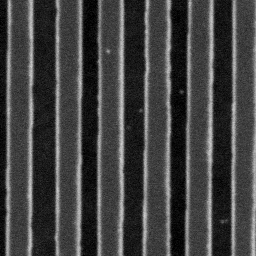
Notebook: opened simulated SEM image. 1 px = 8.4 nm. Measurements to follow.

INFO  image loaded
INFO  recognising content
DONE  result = lines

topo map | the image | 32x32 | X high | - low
-XXX---XXX--XXX---XXX---XXX--XXX
-XXX---XXX--XXX---XXX---XXX--XXX
-XXX---XXX--XXX---XXX---XXX--XXX
-XXX---XXX--XXX---XXX---XXX--XXX
-XXX---XXX--XXX---XXX---XXX--XXX
-XXX---XXX--XXX---XXX---XXX--XXX
-XXX---XXX--XXX---XXX---XX---XXX
-XXX---XXX--XXX---XXX---XX---XXX
-XXX---XXX--XXX---XXX---XX---XXX
-XXX---XXX--XXX---XXX---XXX--XXX
-XXX---XXX--XXX---XXX---XX---XXX
-XXX---XXX--XXX---XXX---XX---XXX
-XXX---XXX--XXX---XXX---XX---XXX
-XXX---XXX--XXX---XXX---XX---XXX
-XXX---XXX--XXX---XXX---XX---XXX
-XXX---XXX--XXX---XXX---XX---XXX
-XXX---XXX--XXX---XXX--XXX---XXX
-XXX---XXX--XXX---XXX--XXX---XXX
-XXX---XXX--XXX---XXX--XXX---XXX
-XXX---XXX--XXX---XXX--XXX---XXX
-XXX---XXX--XXX---XXX--XXX---XXX
-XXX---XXX--XXX---XXX--XXX---XXX
-XXX---XXX--XXX---XXX--XXX---XXX
-XXX---XXX--XXX---XXX--XXX---XXX
-XXX---XXX--XXX---XXX--XXX---XXX
-XXX---XXX--XXX---XXX--XXX---XXX
-XXX---XXX--XXX---XXX--XXX---XXX
-XXX---XXX--XXX---XXX--XXX---XXX
-XXX---XXX--XXX---XXX--XXX---XXX
-XXX---XXX--XXX---XXX--XXX---XXX
-XXX---XXX--XXX---XXX--XXX---XXX
-XXX---XXX--XXX---XXX--XXX---XXX